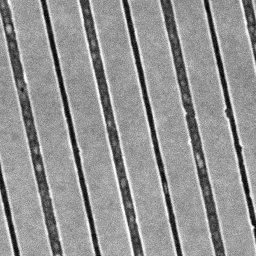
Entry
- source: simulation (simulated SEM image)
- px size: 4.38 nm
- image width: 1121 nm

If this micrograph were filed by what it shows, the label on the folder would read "parallel lines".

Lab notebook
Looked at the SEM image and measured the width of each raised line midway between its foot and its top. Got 136 nm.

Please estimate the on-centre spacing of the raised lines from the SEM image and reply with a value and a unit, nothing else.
174 nm